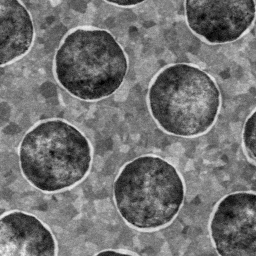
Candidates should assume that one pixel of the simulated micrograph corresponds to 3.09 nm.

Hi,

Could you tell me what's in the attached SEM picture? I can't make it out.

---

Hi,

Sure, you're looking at holes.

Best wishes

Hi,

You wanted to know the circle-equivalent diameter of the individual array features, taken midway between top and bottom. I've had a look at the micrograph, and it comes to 71.9 pixels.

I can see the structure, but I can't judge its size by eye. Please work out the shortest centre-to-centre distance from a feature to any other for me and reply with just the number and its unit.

305 nanometres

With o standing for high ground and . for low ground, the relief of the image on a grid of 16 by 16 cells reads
..oooooooooo....
..oooooooooo....
..oo...oooooo..o
.oo.....oooooooo
ooo.....oo...ooo
oooo...oo.....oo
ooooooooo.....oo
ooo.oooooo...oo.
oo...oooooo.ooo.
o.....ooooooooo.
o.....oo...ooooo
oo...oo....ooooo
ooooooo....ooo..
..oooooo...oo...
...oooooooooo...
...ooooooooooo..